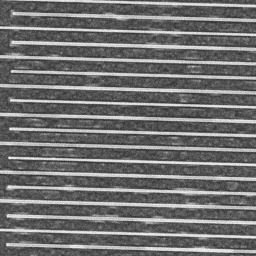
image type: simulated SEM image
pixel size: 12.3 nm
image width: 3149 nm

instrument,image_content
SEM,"parallel lines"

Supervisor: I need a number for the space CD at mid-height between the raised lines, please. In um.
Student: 0.143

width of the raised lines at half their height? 3.12 pixels